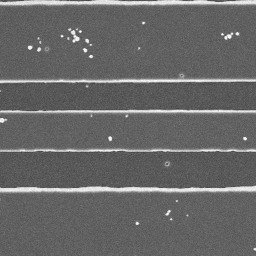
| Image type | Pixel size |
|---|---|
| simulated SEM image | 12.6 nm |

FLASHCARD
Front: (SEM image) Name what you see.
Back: lines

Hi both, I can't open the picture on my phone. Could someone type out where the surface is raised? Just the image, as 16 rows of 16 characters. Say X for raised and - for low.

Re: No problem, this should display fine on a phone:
XXXXXXXXXXXXXXXX
XXXXXXXXXXXXXXXX
XXXXXXXXXXXXXXXX
XXXXXXXXXXXXXXXX
XXXXXXXXXXXXXXXX
----------------
----------------
XXXXXXXXXXXXXXXX
XXXXXXXXXXXXXXXX
----------------
----------------
----------------
XXXXXXXXXXXXXXXX
XXXXXXXXXXXXXXXX
XXXXXXXXXXXXXXXX
XXXXXXXXXXXXXXXX